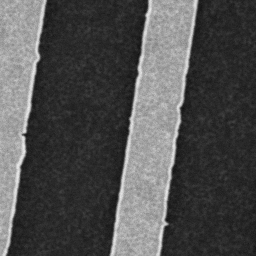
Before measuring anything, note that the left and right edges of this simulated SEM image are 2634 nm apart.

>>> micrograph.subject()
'one or a few lines or trenches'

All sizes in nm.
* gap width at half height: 1080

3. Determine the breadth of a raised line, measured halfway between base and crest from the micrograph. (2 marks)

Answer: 0.469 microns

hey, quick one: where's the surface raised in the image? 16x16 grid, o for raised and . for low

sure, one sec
ooo......ooo....
ooo......ooo....
oo.......ooo....
oo.......ooo....
oo.......ooo....
oo.......oo.....
oo......ooo.....
oo......ooo.....
o.......ooo.....
o.......ooo.....
o.......ooo.....
o.......ooo.....
o.......oo......
o......ooo......
o......ooo......
.......ooo......